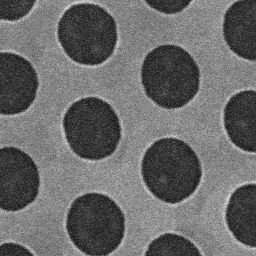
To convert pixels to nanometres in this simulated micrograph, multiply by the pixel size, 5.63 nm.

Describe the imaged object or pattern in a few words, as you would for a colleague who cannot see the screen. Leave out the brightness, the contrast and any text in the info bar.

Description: holes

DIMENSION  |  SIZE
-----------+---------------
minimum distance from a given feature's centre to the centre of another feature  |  513 nm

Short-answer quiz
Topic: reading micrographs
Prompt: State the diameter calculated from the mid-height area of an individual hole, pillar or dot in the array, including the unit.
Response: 353 nm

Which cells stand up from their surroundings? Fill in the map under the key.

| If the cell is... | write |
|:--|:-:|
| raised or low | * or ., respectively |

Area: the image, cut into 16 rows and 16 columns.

..**..***...**..
****...*******..
****...*******..
.***...**...***.
..*******...****
..*******...****
..***..***..**..
****...*******..
****....******..
..***..**...***.
..*******....***
..*******...***.
..***..***..**..
****....******..
****....******..
..***..**...****